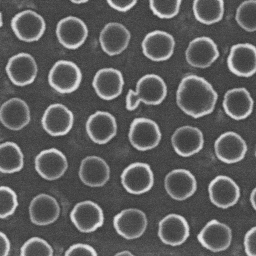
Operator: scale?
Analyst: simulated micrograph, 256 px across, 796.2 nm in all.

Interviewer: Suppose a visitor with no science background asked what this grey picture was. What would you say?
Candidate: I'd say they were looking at a regular array of raised bodies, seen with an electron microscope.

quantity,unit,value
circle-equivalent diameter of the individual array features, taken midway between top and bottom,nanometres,96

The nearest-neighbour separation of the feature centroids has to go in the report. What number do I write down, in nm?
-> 136